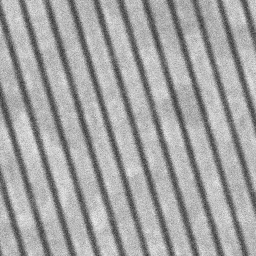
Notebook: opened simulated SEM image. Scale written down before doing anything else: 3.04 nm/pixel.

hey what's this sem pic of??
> parallel lines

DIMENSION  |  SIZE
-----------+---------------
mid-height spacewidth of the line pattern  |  6.71 pixels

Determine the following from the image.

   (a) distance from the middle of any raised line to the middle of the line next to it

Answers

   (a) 71.9 nm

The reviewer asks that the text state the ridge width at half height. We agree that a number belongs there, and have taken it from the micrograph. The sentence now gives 51.3 nm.